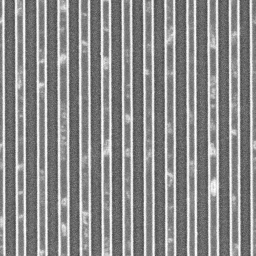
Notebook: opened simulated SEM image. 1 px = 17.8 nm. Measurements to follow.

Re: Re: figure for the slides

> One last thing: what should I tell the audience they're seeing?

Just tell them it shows parallel lines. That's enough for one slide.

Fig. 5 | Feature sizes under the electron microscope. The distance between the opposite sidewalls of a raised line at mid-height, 160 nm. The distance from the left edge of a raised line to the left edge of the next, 21.4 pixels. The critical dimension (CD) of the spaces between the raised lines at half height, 12.5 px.